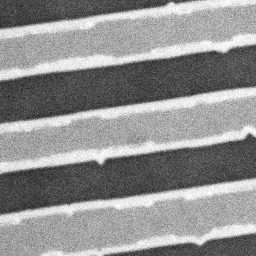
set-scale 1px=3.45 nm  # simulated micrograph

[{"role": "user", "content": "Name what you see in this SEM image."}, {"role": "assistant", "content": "one or a few lines or trenches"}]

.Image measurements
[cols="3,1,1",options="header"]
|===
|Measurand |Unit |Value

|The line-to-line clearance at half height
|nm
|164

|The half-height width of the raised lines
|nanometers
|154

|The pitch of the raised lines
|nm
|321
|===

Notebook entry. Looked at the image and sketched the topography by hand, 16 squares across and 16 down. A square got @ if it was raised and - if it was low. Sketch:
----------@@@@@@
----@@@@@@@@@@@@
@@@@@@@@@@@@@@@@
@@@@@@@@@@------
@@--------------
----------------
----------@@@@@@
----@@@@@@@@@@@@
@@@@@@@@@@@@@@@-
@@@@@@@@--------
@---------------
---------------@
--------@@@@@@@@
-@@@@@@@@@@@@@@@
@@@@@@@@@@@@@@@-
@@@@@@@@--------